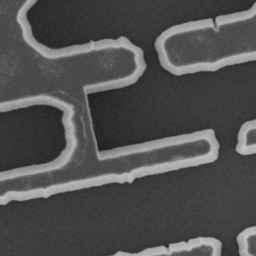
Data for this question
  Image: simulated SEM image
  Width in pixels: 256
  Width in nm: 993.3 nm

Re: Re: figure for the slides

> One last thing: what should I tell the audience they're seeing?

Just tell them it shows one or a few lines or trenches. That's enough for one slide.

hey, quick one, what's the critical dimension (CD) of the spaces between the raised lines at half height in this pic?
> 261 nanometers